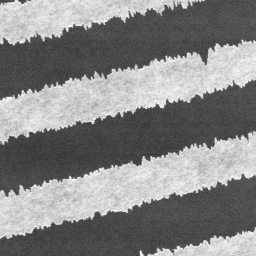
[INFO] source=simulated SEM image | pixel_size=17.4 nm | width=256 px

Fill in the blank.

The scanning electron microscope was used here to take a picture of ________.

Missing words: one or a few lines or trenches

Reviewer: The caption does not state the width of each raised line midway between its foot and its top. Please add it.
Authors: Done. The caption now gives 699 nm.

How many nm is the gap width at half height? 912